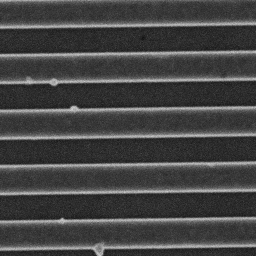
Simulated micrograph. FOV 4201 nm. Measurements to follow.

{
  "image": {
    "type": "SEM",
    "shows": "parallel lines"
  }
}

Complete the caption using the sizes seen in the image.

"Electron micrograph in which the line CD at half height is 468 nanometers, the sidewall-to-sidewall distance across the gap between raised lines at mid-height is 451 nanometers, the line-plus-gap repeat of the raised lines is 0.91 µm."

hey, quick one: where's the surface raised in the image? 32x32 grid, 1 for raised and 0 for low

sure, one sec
11111111111111111111111111111111
11111111111111111111111111111111
11111111111111111111111111111111
00000000000000000000000000000000
00000000000000000000000000000000
00000000000000000000000000000000
00000000000000000000000000000000
11111111111111111111111111111111
11111111111111111111111111111111
11111111111111111111111111111111
00000010000000000000000000000000
00000000000000000000000000000000
00000000000000000000000000000000
00000000010000000000000001111111
11111111111111111111111111111111
11111111111111111111111111111111
11111111111111111111111111111111
00000000000000000000000000000000
00000000000000000000000000000000
00000000000000000000000000000000
00000000000000000000000001111111
11111111111111111111111111111111
11111111111111111111111111111111
11111111111111111111111111111111
00000000000000000000000000000000
00000000000000000000000000000000
00000000000000000000000000000000
00000000000000000111111111111111
11111111111111111111111111111111
11111111111111111111111111111111
11111111111111111111111111111111
00000000000010000000000000000000